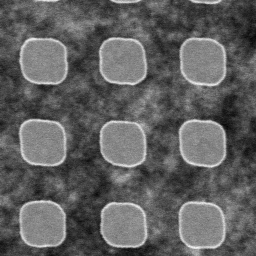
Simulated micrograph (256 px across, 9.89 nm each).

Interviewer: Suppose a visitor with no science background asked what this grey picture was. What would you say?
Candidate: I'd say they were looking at a regular array of raised bodies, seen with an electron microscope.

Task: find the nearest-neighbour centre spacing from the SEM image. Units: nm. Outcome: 786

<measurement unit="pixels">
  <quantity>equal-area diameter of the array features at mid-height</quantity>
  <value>48.6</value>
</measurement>